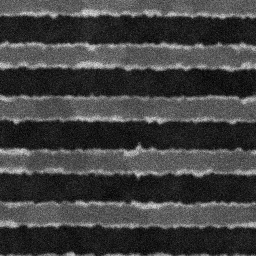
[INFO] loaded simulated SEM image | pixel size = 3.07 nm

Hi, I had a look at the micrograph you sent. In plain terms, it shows parallel lines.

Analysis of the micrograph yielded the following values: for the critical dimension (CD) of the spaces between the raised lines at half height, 0.0917 µm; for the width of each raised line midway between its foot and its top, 0.0683 microns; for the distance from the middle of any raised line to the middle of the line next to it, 162 nm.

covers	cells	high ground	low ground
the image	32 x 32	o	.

oooooooooooooooooooooooooooooooo
oooooooooooooooooooooooooooooooo
................................
................................
................................
o..oo...........................
oooooooooooooooooooooooooooooooo
oooooooooooooooooooooooooooooooo
....o....o...o.ooo.ooo....oooo.o
................................
................................
................................
oooooooooooooooooooooooooooooooo
oooooooooooooooooooooooooooooooo
oooooooooooooooooooooooooooooooo
................................
................................
................................
................................
oooooooooooooooooooooooooooooooo
oooooooooooooooooooooooooooooooo
.o.o.oooooo..o.o.ooooooooooooooo
................................
................................
................................
oooo.ooooooooooooooo.o..o.oo...o
oooooooooooooooooooooooooooooooo
oooooooooooooooooooooooooooooooo
................................
................................
................................
................................